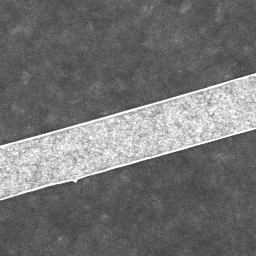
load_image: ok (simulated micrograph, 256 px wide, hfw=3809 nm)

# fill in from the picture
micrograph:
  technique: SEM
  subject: one or a few lines or trenches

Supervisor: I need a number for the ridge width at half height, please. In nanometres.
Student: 762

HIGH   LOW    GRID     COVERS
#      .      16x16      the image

................
................
................
................
................
.............###
..........######
......##########
...###########..
###########.....
#######.........
###.............
................
................
................
................